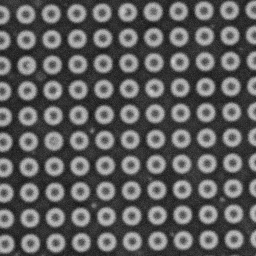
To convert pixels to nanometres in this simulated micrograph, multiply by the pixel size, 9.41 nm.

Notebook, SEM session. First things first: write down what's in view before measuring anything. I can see an array of small figures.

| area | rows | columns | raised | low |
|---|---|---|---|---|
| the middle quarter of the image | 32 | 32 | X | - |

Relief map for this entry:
-XXXXX--XXXX--XXXX--XXXXX--XXXX-
--XXX---XXX----XXX---XXX----XX--
--------------------------------
--------------------------------
---XX----XX----XXX---XXX---XXXX-
-XXXXX--XXXX--XXXXX--XXXX--XXXX-
-XXXXX--XXXX--XXXXX-XXXXX--XXXX-
--XXXX--XXXX--XXXX---XXX---XXXX-
---X----------------------------
--------------------------------
---------XX----XX-----XX----XXX-
--XXXX--XXXX--XXXX---XXXX--XXXX-
-XXXXX--XXXX--XXXXX--XXXX--XXXX-
--XXXX--XXXX--XXXX---XXXX--XXXX-
--XXX----XXX---XXX----XX--------
--------------------------------
--------------------------------
--XXX----XXX---XXX---XXXX--XXXX-
--XXXX--XXXX--XXXXX--XXXX--XXXXX
--XXXX--XXXX--XXXXX--XXXX--XXXX-
--XXXX--XXXX---XXX---XXXX---XXX-
--------------------------------
--------------------------------
---XX----XX----XXX----XXX---XXX-
--XXXX--XXXX---XXXX--XXXX--XXXXX
--XXXX--XXXXX-XXXXX--XXXX--XXXXX
--XXXX--XXXX---XXXX--XXXX---XXX-
---XX----XX---------------------
--------------------------------
----------------------XX----XXX-
--XXXX---XXX---XXXX--XXXX--XXXXX
--XXXX--XXXXX--XXXX--XXXX--XXXXX